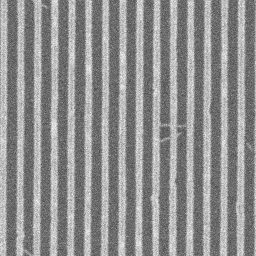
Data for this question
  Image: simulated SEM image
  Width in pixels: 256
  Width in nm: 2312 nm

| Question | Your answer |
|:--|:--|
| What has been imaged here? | parallel lines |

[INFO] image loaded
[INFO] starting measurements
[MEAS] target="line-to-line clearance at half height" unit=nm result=105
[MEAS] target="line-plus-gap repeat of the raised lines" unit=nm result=153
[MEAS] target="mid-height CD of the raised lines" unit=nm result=51.9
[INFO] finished